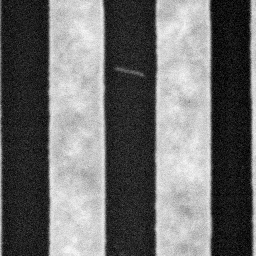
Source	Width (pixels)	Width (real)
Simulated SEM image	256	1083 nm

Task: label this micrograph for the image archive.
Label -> lines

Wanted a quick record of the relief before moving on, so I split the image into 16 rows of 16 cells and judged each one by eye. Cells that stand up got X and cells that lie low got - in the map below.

---XXX----XXX---
---XXX----XXX---
---XXX----XXX---
---XXX----XXX---
---XXX----XXX---
---XXX----XXX---
---XXX----XXX---
---XXXX---XXX---
---XXXX---XXX---
---XXXX---XXX---
---XXXX---XXX---
---XXXX---XXX---
---XXXX---XXX---
---XXXX---XXX---
---XXXX---XXX---
---XXXX---XXX---